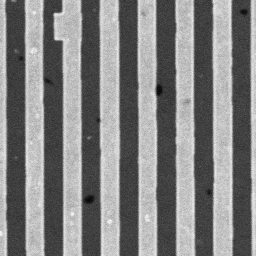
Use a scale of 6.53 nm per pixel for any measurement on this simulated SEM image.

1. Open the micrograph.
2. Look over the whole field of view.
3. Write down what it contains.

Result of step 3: wiring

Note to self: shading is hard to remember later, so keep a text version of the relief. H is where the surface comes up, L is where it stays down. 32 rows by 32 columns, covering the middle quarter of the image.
HHHHLLLLLHHHHLLLLLLHHHHLLLLLHHHH
HHHHLLLLLHHHHLLLLLLHHHHLLLLLHHHH
HHHHLLLLLHHHHLLLLLLHHHHLLLLLHHHH
HHHHLLLLLHHHHLLLLLLHHHHLLLLLHHHH
HHHHLLLLLHHHHLLLLLLHHHHLLLLLHHHH
HHHHLLLLLHHHHLLLLLLHHHHLLLLLHHHH
HHHHLLLLLHHHHLLLLLLHHHHLLLLLHHHH
HHHHLLLLLHHHHLLLLLLHHHHLLLLLHHHH
HHHHLLLLLHHHHLLLLLLHHHHLLLLLHHHH
HHHHLLLLLHHHHLLLLLLHHHHLLLLLHHHH
HHHHLLLLLHHHHLLLLLLHHHHLLLLLHHHH
HHHHLLLLLHHHHLLLLLLHHHHLLLLLHHHH
HHHHLLLLLHHHHLLLLLLHHHHLLLLLHHHH
HHHHLLLLLHHHHLLLLLLHHHHLLLLLHHHH
HHHHLLLLLHHHHLLLLLLHHHHLLLLLHHHH
HHHHLLLLLHHHHLLLLLLHHHHLLLLLHHHH
HHHHLLLLLHHHHLLLLLLHHHHLLLLLHHHH
HHHHLLLLLHHHHLLLLLLHHHHLLLLLHHHH
HHHHLLLLLHHHHLLLLLLHHHHLLLLLHHHH
HHHHLLLLLHHHHLLLLLLHHHHLLLLLHHHH
HHHHLLLLLHHHHLLLLLLHHHHLLLLLHHHH
HHHHLLLLLHHHHLLLLLLHHHHLLLLLHHHH
HHHHLLLLLLHHHLLLLLLHHHHLLLLLHHHH
HHHHLLLLLLHHHLLLLLLHHHHLLLLLHHHH
HHHHLLLLLLHHHLLLLLLHHHHLLLLLHHHH
HHHHLLLLLLHHHLLLLLLHHHHLLLLLHHHH
HHHHLLLLLLHHHLLLLLLHHHHLLLLLHHHH
HHHHLLLLLLHHHLLLLLLHHHHLLLLLHHHH
HHHHLLLLLLHHHLLLLLLHHHHLLLLLHHHH
HHHHLLLLLLHHHLLLLLLHHHHLLLLLHHHH
HHHHLLLLLLHHHLLLLLLHHHHLLLLLHHHH
HHHHLLLLLLHHHLLLLLLHHHHLLLLLHHHH